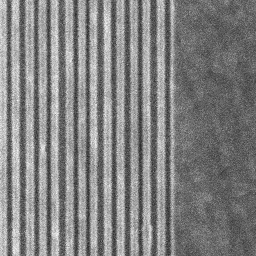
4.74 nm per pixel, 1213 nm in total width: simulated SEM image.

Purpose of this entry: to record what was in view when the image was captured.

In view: parallel lines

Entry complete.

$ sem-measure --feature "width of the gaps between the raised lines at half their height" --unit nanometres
31.4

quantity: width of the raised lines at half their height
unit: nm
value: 32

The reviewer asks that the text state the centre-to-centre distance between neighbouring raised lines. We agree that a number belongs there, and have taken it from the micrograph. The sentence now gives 13.2 pixels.